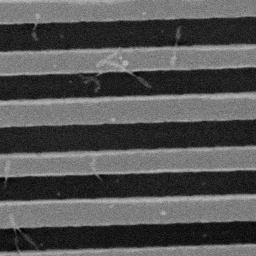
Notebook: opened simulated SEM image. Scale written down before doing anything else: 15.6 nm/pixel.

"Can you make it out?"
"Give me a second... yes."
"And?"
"lines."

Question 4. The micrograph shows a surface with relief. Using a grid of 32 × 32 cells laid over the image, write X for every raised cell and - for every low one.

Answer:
XXXXXXXXXXXXXXXXXXXXXXXXXXXXXXXX
XXXXXXXXXXXXXXXXXXXXXXXXXXXXXXXX
XXXXXXXXXXXXXXX-----------------
--------------------------------
--------------------------------
--------------------------------
-----XXXXXXXXXXXXXXXXXXXXXXXXXXX
XXXXXXXXXXXXXXXXXXXXXXXXXXXXXXXX
XXXXXXXXXXXXXXXXXXXXXXXXXXXX----
--------------------------------
--------------------------------
--------------------------------
-------XXXXXXXXXXXXXXXXXXXXXXXXX
XXXXXXXXXXXXXXXXXXXXXXXXXXXXXXXX
XXXXXXXXXXXXXXXXXXXXXXXXXXXXXXXX
XXXXXXXXX-----------------------
--------------------------------
--------------------------------
---------------------------XXXXX
XXXXXXXXXXXXXXXXXXXXXXXXXXXXXXXX
XXXXXXXXXXXXXXXXXXXXXXXXXXXXXXXX
XXXXXXXXXXXXXXXXXXXX------------
--------------------------------
--------------------------------
----------------------------XXXX
XXXXXXXXXXXXXXXXXXXXXXXXXXXXXXXX
XXXXXXXXXXXXXXXXXXXXXXXXXXXXXXXX
XXXXXXXXXXXXXXXXXXXXXXXXXXXXXXXX
XXX-----------------------------
--------------------------------
--------------------------------
--X--XXXXXXXXXXXXXXXXXXXXXXXXXXX